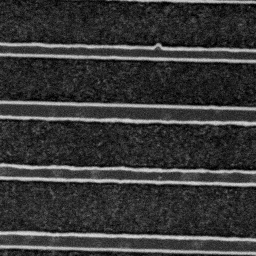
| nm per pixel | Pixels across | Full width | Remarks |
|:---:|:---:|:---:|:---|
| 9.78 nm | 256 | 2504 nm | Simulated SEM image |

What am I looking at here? one or a few lines or trenches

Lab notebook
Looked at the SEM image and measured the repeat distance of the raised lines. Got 621 nm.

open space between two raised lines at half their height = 463 nm